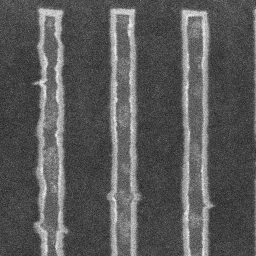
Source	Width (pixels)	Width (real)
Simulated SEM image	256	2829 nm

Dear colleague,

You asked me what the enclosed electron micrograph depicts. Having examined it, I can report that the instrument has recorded one or a few lines or trenches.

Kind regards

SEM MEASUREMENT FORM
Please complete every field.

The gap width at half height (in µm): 0.574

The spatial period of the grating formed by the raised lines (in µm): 0.797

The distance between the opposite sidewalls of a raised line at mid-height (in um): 0.222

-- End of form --